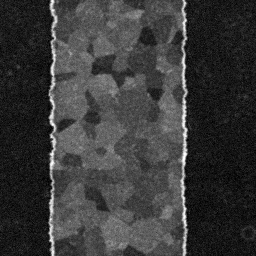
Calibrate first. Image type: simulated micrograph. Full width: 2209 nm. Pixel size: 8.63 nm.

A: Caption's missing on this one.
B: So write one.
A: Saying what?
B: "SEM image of one or a few lines or trenches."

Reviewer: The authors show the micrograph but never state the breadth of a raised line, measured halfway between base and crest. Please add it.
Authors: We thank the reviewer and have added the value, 1130 nanometers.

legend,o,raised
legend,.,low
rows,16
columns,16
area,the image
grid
...oooooooo.....
...ooooooooo....
...oooooooo.....
...oooooooo.....
...ooooooooo....
...ooooooooo....
...ooooooooo....
...ooooooooo....
...ooooooooo....
...ooooooooo....
...oooooooo.....
...oooooooo.....
...ooooooooo....
...ooooooooo....
...ooooooooo....
...ooooooooo....